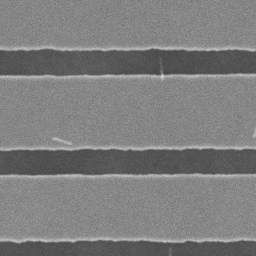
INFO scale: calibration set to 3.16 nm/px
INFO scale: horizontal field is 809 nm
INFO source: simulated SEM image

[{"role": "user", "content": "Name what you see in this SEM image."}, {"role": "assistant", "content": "lines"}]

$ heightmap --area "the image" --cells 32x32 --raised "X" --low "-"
XXXXXXXXXXXXXXXXXXXXXXXXXXXXXXXX
XXXXXXXXXXXXXXXXXXXXXXXXXXXXXXXX
XXXXXXXXXXXXXXXXXXXXXXXXXXXXXXXX
XXXXXXXXXXXXXXXXXXXXXXXXXXXXXXXX
XXXXXXXXXXXXXXXXXXXXXXXXXXXXXXXX
XXXXXXXXXXXXXXXXXXXXXXXXXXXXXXXX
--------------------------------
--------------------------------
--------------------------------
-----XX---X-XXXXXXXXXXXXXXXXXXXX
XXXXXXXXXXXXXXXXXXXXXXXXXXXXXXXX
XXXXXXXXXXXXXXXXXXXXXXXXXXXXXXXX
XXXXXXXXXXXXXXXXXXXXXXXXXXXXXXXX
XXXXXXXXXXXXXXXXXXXXXXXXXXXXXXXX
XXXXXXXXXXXXXXXXXXXXXXXXXXXXXXXX
XXXXXXXXXXXXXXXXXXXXXXXXXXXXXXXX
XXXXXXXXXXXXXXXXXXXXXXXXXXXXXXXX
XXXXXXXXXXXXXXXXXXXXXXXXXXXXXXXX
XXXXXXXXXXXXXXXXXXXXXXXXXXXXXXXX
--------------------------------
--------------------------------
--------------------------------
XXXXXXXXXXXXXXXXXXXXXXXXXXXXXXXX
XXXXXXXXXXXXXXXXXXXXXXXXXXXXXXXX
XXXXXXXXXXXXXXXXXXXXXXXXXXXXXXXX
XXXXXXXXXXXXXXXXXXXXXXXXXXXXXXXX
XXXXXXXXXXXXXXXXXXXXXXXXXXXXXXXX
XXXXXXXXXXXXXXXXXXXXXXXXXXXXXXXX
XXXXXXXXXXXXXXXXXXXXXXXXXXXXXXXX
XXXXXXXXXXXXXXXXXXXXXXXXXXXXXXXX
--------------------------------
--------------------------------